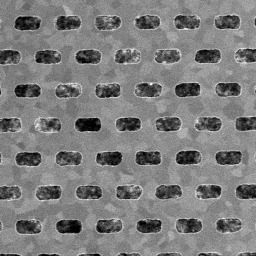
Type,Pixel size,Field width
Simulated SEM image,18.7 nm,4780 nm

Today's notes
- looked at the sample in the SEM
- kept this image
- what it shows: a regular array of holes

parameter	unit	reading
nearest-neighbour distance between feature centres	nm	730